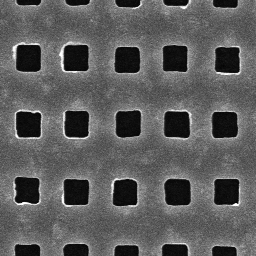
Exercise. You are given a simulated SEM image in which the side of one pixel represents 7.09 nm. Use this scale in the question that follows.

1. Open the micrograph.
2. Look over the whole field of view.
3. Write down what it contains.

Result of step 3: a regular array of holes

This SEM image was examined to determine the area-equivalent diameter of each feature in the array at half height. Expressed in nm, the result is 202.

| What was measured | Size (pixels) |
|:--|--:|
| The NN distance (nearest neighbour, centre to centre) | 48.2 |